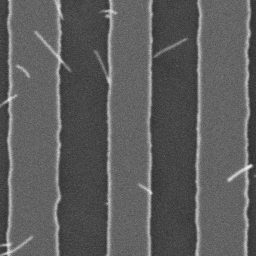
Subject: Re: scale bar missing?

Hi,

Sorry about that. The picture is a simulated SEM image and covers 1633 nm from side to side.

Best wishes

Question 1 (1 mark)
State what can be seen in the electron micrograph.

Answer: lines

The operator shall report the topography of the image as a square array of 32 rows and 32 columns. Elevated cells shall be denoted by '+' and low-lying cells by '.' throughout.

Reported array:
.++++++.......+++++......++++++.
.+++++++......+++++......++++++.
.++++++.......+++++......++++++.
.+++++++......+++++......++++++.
.+++++++......+++++......++++++.
.++++++.......+++++......++++++.
.++++++.......+++++......++++++.
.+++++++......+++++......++++++.
.++++++.......+++++......++++++.
.++++++.......+++++......++++++.
.++++++.......+++++......++++++.
.++++++.......+++++......++++++.
.++++++......++++++......++++++.
.++++++......++++++......++++++.
.++++++......++++++......++++++.
.+++++++.....++++++......++++++.
.++++++.......+++++......++++++.
.++++++......++++++......++++++.
.++++++.......+++++......++++++.
.++++++......++++++......++++++.
.++++++......++++++......++++++.
.++++++......++++++......++++++.
.++++++.......+++++......++++++.
.++++++.......+++++......++++++.
.++++++.......+++++......++++++.
.++++++.......+++++......++++++.
.++++++.......+++++......++++++.
.++++++......++++++......++++++.
.++++++......++++++......++++++.
.++++++......++++++......++++++.
.++++++......++++++......++++++.
.++++++......++++++......++++++.